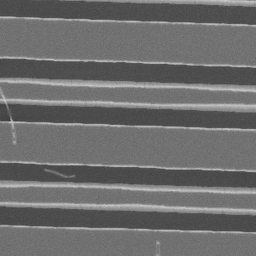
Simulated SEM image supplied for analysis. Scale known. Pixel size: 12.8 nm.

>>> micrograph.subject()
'lines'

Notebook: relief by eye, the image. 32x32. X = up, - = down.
--------------------------------
--------------------------------
XXXXXXXXXXXX--------------------
XXXXXXXXXXXXXXXXXXXXXXXXXXXXXXXX
XXXXXXXXXXXXXXXXXXXXXXXXXXXXXXXX
XXXXXXXXXXXXXXXXXXXXXXXXXXXXXXXX
XXXXXXXXXXXXXXXXXXXXXXXXXXXXXXXX
------XXXXXXXXXXXXXXXXXXXXXXXXXX
--------------------------------
--------------------------------
XXXXXXXXXXXXX-------------------
XXXXXXXXXXXXXXXXXXXXXXXXXXXXXXXX
XXXXXXXXXXXXXXXXXXXXXXXXXXXXXXXX
------------------------------XX
--------------------------------
XXXXXXXXXXX---------------------
XXXXXXXXXXXXXXXXXXXXXXXXXXXXXXXX
XXXXXXXXXXXXXXXXXXXXXXXXXXXXXXXX
XXXXXXXXXXXXXXXXXXXXXXXXXXXXXXXX
XXXXXXXXXXXXXXXXXXXXXXXXXXXXXXXX
------XXXXXXXXXXXXXXXXXXXXXXXXXX
--------------------------------
--------------------------------
XXXXXXXXXXXXXXXXXXX-------------
XXXXXXXXXXXXXXXXXXXXXXXXXXXXXXXX
XXXXXXXXXXXXXXXXXXXXXXXXXXXXXXXX
-------------------------------X
--------------------------------
XXXXXXXXXXX---------------------
XXXXXXXXXXXXXXXXXXXXXXXXXXXXXXXX
XXXXXXXXXXXXXXXXXXXXXXXXXXXXXXXX
XXXXXXXXXXXXXXXXXXXXXXXXXXXXXXXX